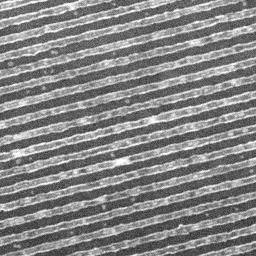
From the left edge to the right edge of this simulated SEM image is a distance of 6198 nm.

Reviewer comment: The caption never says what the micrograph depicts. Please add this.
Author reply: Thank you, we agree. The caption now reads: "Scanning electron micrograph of parallel lines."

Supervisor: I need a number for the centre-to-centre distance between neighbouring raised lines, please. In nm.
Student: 393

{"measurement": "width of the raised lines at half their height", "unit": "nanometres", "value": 156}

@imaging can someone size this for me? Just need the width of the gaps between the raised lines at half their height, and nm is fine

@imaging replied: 241